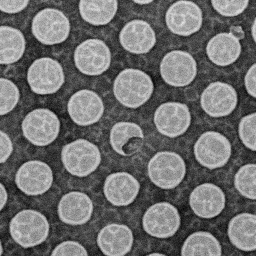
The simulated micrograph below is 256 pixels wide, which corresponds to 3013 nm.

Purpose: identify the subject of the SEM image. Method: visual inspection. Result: a regular array of raised bodies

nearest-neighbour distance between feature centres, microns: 0.583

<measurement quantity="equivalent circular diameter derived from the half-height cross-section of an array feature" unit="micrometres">0.41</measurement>